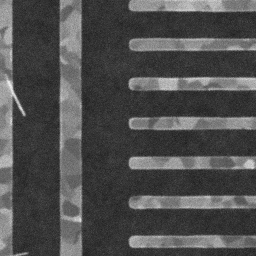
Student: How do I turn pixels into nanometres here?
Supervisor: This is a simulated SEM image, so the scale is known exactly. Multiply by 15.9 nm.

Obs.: groups of lines, slits or small figures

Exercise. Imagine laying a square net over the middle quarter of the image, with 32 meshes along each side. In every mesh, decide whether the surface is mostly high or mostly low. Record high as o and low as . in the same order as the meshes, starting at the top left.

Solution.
oooo............................
oooo............................
oooo............................
oooo............................
oooo............oooooooooooooooo
oooo............oooooooooooooooo
oooo............................
oooo............................
oooo............................
oooo............................
oooo............................
oooo............................
oooo............................
oooo......................ooo...
oooo............oooooooooooooooo
oooo............oooooooooooooooo
oooo............................
oooo............................
oooo............................
oooo............................
oooo............................
oooo............................
oooo............................
oooo.............ooooooooooooooo
oooo............oooooooooooooooo
oooo............oooooooooooooooo
oooo............................
oooo............................
oooo............................
oooo............................
oooo............................
oooo............................